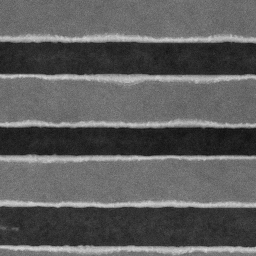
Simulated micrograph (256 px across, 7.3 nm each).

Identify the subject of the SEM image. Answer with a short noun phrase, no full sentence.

lines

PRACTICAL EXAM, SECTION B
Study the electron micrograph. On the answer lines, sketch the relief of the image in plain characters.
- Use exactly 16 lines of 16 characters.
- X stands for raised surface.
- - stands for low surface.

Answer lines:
XXXXXXXXXXXXXXXX
XXXXXXXXXXXXXXXX
XXXXXXXXXXXXXXXX
----------------
----------------
XXXXXXXXXXXXXXXX
XXXXXXXXXXXXXXXX
XXXXXXXXXXXXXXXX
----------------
----------------
XXXXXXXXXXXXXXXX
XXXXXXXXXXXXXXXX
XXXXXXXXXXXXXXXX
----------------
----------------
XXXXXXXXXXXXXXXX